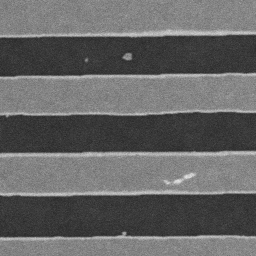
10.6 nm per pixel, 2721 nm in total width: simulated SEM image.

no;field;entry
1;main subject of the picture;lines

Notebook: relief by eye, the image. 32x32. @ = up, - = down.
@@@@@@@@@@@@@@@@@@@@@@@@@@@@@@@@
@@@@@@@@@@@@@@@@@@@@@@@@@@@@@@@@
@@@@@@@@@@@@@@@@@@@@@@@@@@@@@@@@
@@@@@@@@@@@@@@@@@@@@@@@@@@@@@@@@
@@@@@---------------------------
--------------------------------
--------------------------------
--------------------------------
--------------------------------
----------@@@@@@@@@@@@@@@@@@@@@@
@@@@@@@@@@@@@@@@@@@@@@@@@@@@@@@@
@@@@@@@@@@@@@@@@@@@@@@@@@@@@@@@@
@@@@@@@@@@@@@@@@@@@@@@@@@@@@@@@@
@@@@@@@@@@@@@@@@@@@@@@@@@@@@@@@@
--------------------------------
--------------------------------
--------------------------------
--------------------------------
--------------------------------
@@@@@@@@@@@@@@@@@@@@@@@@@@@@@@@@
@@@@@@@@@@@@@@@@@@@@@@@@@@@@@@@@
@@@@@@@@@@@@@@@@@@@@@@@@@@@@@@@@
@@@@@@@@@@@@@@@@@@@@@@@@@@@@@@@@
@@@@@@@@@@@@@@@@@@@@@@@@@@@@@@@@
--------------------------------
--------------------------------
--------------------------------
--------------------------------
--------------------------------
--------------------------------
@@@@@@@@@@@@@@@@@@@@@@@@@@@@@@@@
@@@@@@@@@@@@@@@@@@@@@@@@@@@@@@@@